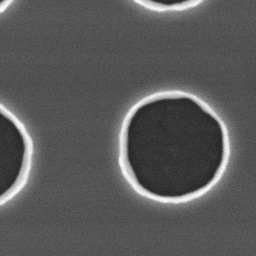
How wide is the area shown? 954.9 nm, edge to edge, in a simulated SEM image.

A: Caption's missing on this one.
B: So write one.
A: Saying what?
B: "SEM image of holes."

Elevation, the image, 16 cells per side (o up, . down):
oooooooooooooooo
oooooooooooooooo
oooooooooooooooo
oooooooooooooooo
oooooooooooooooo
oooooooooooooooo
ooooooooo....ooo
.ooooooo......oo
.ooooooo......oo
..oooooo......oo
..oooooo......oo
.oooooooo....ooo
oooooooooooooooo
oooooooooooooooo
oooooooooooooooo
oooooooooooooooo